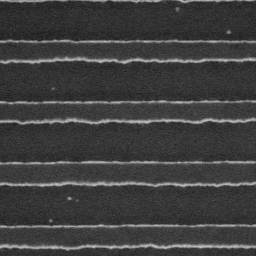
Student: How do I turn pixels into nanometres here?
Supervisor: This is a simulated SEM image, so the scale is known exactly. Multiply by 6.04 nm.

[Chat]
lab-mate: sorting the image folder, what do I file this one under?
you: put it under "lines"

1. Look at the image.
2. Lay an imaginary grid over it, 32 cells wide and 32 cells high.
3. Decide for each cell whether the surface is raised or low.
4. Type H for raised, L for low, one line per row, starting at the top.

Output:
LLLLLLLLLLLLLLLLLLLLLLLLLLLLLLLL
LLLLLLLLLLLLLLLLLLLLLLLLLLLLLLLL
LLLLLLLLLLLLLLLLLLLLLLLLLLLLLLLL
LLLLLLLLLLLLLLLLLLLLLLLLLLLLLLLL
LLLLLLLLLLLLLLLLLLLLLLLLLLLLLLLL
HHHHHHHHHHHHHHHHHHHHHHHHHHHHHHHH
HHHHHHHHHHHHHHHHHHHHHHHHHHHHHHHH
HHHHHHHHHLHHHHHHHHHHHHHHHHHHHHHH
LLLLLLLLLLLLLLLLLLLLLLLLLLLLLLLL
LLLLLLLLLLLLLLLLLLLLLLLLLLLLLLLL
LLLLLLLLLLLLLLLLLLLLLLLLLLLLLLLL
LLLLLLLLLLLLLLLLLLLLLLLLLLLLLLLL
LLLLLLLLLLLLLLLLLLLLLLLLLLLLLLLL
HHHHHHHHHHHHHHHHHHHHHHHHHHHHHHHH
HHHHHHHHHHHHHHHHHHHHHHHHHHHHHHHH
LLLLLLLLLLLLLLLLLLLLLLLLLLLLLLLL
LLLLLLLLLLLLLLLLLLLLLLLLLLLLLLLL
LLLLLLLLLLLLLLLLLLLLLLLLLLLLLLLL
LLLLLLLLLLLLLLLLLLLLLLLLLLLLLLLL
LLLLLLLLLLLLLLLLLLLLLLLLLLLLLLLL
HHHHHHHHHHHHHHHHHHHHHHHHHHHHHHHH
HHHHHHHHHHHHHHHHHHHHHHHHHHHHHHHH
HHHHHHHHHHHHHHHHHHHHHHHHHHHHHHHH
LLLLLLLLLLLLLLLLLLLLLLLLLLLLLLLL
LLLLLLLLLLLLLLLLLLLLLLLLLLLLLLLL
LLLLLLLLLLLLLLLLLLLLLLLLLLLLLLLL
LLLLLLLLLLLLLLLLLLLLLLLLLLLLLLLL
LLLLLLLLLLLLLLLLLLLLLLLLLLLLLLLL
HHHHHHHHHHHHHHHHHHHHHHHHHHHHHHHH
HHHHHHHHHHHHHHHHHHHHHHHHHHHHHHHH
HHHHHHHHHHHHHHHHHHHHHHHHHHHHHHHH
LLLLLLLLLLLLLLLLLLLLLLLLLLLLLLLL